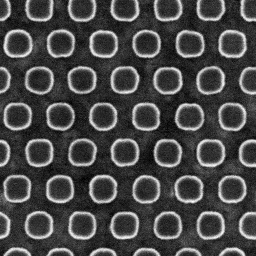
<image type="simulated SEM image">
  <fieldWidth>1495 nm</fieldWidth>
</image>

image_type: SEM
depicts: a regular array of raised bodies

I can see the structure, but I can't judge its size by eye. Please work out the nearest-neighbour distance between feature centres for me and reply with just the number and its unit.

41.9 pixels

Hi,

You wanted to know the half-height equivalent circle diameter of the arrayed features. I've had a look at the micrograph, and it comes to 27.8 px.